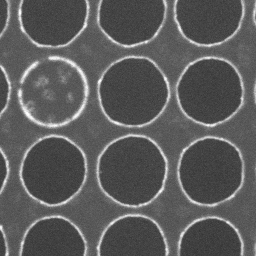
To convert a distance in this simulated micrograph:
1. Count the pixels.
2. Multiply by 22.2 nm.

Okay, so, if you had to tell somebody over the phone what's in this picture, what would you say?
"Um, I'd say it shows holes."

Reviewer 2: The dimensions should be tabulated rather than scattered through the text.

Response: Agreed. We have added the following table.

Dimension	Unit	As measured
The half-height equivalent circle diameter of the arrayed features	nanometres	1450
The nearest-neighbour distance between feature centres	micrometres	1.74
